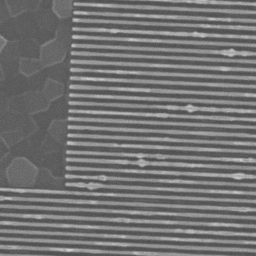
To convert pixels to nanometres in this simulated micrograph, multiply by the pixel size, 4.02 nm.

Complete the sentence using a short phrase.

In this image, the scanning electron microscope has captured parallel lines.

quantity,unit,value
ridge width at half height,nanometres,13.6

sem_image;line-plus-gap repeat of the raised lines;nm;33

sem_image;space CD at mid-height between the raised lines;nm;20.6